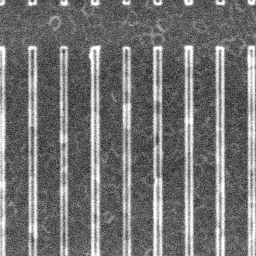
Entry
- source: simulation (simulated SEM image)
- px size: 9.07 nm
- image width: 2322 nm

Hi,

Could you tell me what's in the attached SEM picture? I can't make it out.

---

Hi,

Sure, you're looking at parallel lines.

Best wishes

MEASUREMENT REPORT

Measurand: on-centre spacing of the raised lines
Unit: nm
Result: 284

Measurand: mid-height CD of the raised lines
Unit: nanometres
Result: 51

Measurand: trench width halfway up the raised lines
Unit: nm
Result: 231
